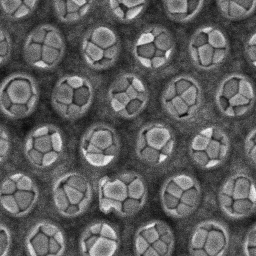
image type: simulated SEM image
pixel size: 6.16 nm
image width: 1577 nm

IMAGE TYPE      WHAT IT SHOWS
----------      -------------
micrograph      a regular array of raised bodies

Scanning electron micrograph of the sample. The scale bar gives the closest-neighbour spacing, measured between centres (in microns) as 0.325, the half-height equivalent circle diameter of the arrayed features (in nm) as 217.